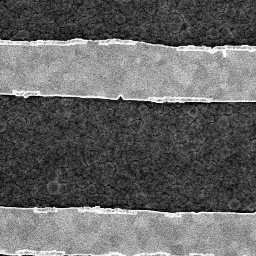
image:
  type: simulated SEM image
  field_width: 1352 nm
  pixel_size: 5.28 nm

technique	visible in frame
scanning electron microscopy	one or a few lines or trenches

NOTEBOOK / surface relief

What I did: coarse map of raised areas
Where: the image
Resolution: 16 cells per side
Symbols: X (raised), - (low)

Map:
----------------
----------------
----X-XX--------
XXXXXXXXXXXXXXXX
XXXXXXXXXXXXXXXX
XXXXXXXXXXXXXXXX
----------------
----------------
----------------
----------------
----------------
----------------
----------------
XXXXXXXXXXXXXXXX
XXXXXXXXXXXXXXXX
XXXXXXXXXXXXXXXX